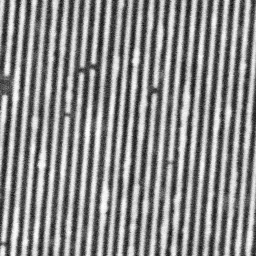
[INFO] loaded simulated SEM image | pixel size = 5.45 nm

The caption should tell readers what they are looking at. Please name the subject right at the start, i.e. parallel lines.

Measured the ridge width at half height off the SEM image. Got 21.1 nm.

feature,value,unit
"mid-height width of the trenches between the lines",36.7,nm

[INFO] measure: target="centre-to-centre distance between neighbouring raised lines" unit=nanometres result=58.1